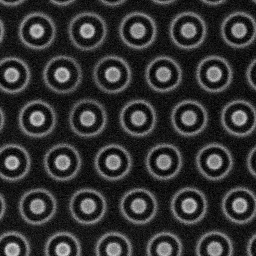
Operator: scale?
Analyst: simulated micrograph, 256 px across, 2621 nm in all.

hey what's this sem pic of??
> an array of small figures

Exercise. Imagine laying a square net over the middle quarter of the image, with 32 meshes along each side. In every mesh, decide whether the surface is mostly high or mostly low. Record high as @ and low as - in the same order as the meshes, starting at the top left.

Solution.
---@@@@@@------@@@@@@@------@@@@
----@@@@---@@---@@@@@---@@--@@@@
@---@@@@---@@@--@@@@@--@@@---@@@
@---@@@@---@@@--@@@@@--@@@---@@@
---@@@@@@-------@@@@@@------@@@@
---@@@@@@------@@@@@@@-----@@@@@
-@@@@@@@@@@--@@@@@@@@@@@@@@@@@@@
@@@@@@@@@@@@@@@@@@@@@@@@@@@@@@@@
@@@@@@@@@@@@@@@@@@@@@@@@@@@@@@@@
@@@@@-@@@@@@@@@@@@@@@@@@@@@@@@@@
@@@------@@@@@@@-----@@@@@@@@---
@@@-------@@@@@-------@@@@@@----
@@---@@---@@@@@--@@@--@@@@@---@@
@@--@@@@--@@@@@--@@@--@@@@@---@@
@@--@@@---@@@@@--@@@--@@@@@@--@@
@@--------@@@@@-------@@@@@@----
@@@------@@@@@@@-----@@@@@@@@---
@@@@@--@@@@@@@@@@@-@@@@@@@@@@@@@
@@@@@@@@@@@@@@@@@@@@@@@@@@@@@@@@
@@@@@@@@@@@@@@@@@@@@@@@@@@@@@@@@
@@@@@@@@@@@@@@@@@@@@@@@@@-@@@@@@
--@@@@@@@@----@@@@@@@@@-----@@@@
---@@@@@@------@@@@@@@------@@@@
@--@@@@@@--@@@--@@@@@---@@---@@@
@---@@@@---@@@--@@@@@--@@@@--@@@
@--@@@@@---@@@--@@@@@---@@---@@@
---@@@@@@-------@@@@@@------@@@@
--@@@@@@@@-----@@@@@@@@----@@@@@
@@@@@@@@@@@@-@@@@@@@@@@@@@@@@@@@
@@@@@@@@@@@@@@@@@@@@@@@@@@@@@@@@
@@@@@@@@@@@@@@@@@@@@@@@@@@@@@@@@
@@@@@@@@@@@@@@@@@@@@@@@@@@@@@@@-